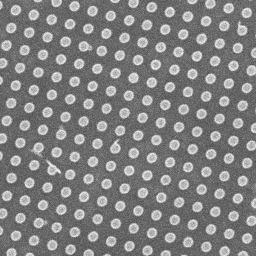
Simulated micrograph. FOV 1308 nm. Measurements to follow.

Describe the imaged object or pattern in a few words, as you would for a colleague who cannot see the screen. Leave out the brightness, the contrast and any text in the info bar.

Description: a regular array of raised bodies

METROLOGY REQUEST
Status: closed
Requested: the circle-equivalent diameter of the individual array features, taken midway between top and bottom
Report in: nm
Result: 48.6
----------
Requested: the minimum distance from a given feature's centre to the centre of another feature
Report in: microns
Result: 0.0924